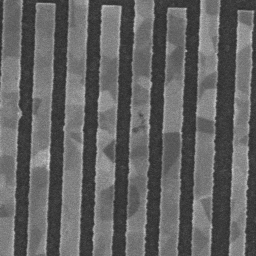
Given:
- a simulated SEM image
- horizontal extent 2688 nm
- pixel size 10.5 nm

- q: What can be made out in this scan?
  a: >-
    parallel lines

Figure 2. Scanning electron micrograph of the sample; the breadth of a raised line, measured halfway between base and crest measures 198 nanometres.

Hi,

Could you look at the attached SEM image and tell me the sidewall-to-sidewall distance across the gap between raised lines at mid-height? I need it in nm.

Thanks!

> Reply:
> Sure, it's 150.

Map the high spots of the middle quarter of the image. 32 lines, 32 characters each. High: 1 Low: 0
01111000011111000111110000111100
01111000011111000111110001111101
01111000011111000111110001111100
01111000011110000111110001111100
01111000011110000111110001111100
11111000011111000111110001111100
01111000011110000111110001111100
01111000011110000111100001111100
11111000011110000111100001111100
11111000011110000111100001111100
11111000011110000111100001111100
11111000011110000111100001111100
11111000011110000100100001111100
11111000011110000110100001111100
11111000011110000110100001111100
11111000011110000100100001111000
11111000111110000000100001111000
11111000111110000111100001111000
11111000111110001111100001111000
11111000111110001111100001111001
11111000111110001111100001111000
11111000111110001111101001111000
11110000111110001111100001111000
11111000111110001111100001111000
11111000111110001111100001111000
11111000111110001111100001111000
11110000111110001111100011111000
11111000111110001111100011111000
11110000111110001111100011111000
11110000111110001111100011111001
11110000111100001111100011111000
11110000111110001111100011111000